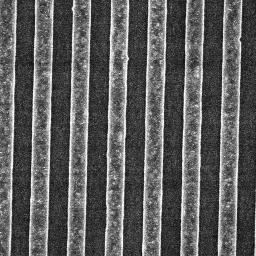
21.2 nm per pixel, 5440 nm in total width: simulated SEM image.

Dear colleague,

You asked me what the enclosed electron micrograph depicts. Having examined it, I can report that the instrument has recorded parallel lines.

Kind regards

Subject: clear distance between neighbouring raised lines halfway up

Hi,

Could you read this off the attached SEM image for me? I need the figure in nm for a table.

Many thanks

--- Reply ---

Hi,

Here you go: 438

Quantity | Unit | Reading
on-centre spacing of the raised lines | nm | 801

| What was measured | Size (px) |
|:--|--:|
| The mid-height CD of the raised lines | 16.7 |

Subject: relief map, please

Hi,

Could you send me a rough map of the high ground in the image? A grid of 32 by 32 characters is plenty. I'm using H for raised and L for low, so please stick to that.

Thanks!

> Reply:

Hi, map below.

HHLLHHHLLHHLLLHHLLLHHLLHHLLLHHLL
HHLLHHHLLHHLLLHHLLLHHLLHHLLLHHLL
HHLLHHHLLHHLLLHHLLLHHLLHHLLLHHLL
HHLLHHLLLHHLLLHHLLLHHLLHHLLLHHLL
HHLLHHLLLHHLLLHHLLLHHLLHHLLLHHLL
HHLLHHLLLHHLLLHHLLLHHLLHHLLLHHLL
HHLLHHHLLHHLLLHHLLLHHLLHHLLLHHLL
HHLLHHLLLHHLLLHHLLLHHLLHHLLLHHLL
HHLLHHLLLHHLLLHHLLHHHLLHHLLLHHLL
HHLLHHLLLHHLLLHHLLHHHLLHHLLLHHLL
HHLLHHLLLHHLLLHHLLHHHLLHHLLLHHLL
HHLLHHLLLHHLLLHHLLHHLLLHHLLLHHLL
HHLLHHLLLHHLLLHHLLHHLLLHHLLLHHLL
HHLLHHLLLHHLLLHHLLHHLLLHHLLLHHLL
HHLLHHLLLHHLLLHHLLHHLLLHHLLLHHLL
HHLLHHLLLHHLLLHHLLHHLLLHHLLLHHLL
HHLLHHLLLHHLLLHHLLHHLLLHHLLLHHLL
HHLLHHLLLHHLLHHHLLHHLLLHHLLLHHLL
HHLLHHLLLHHLLHHHLLHHLLLHHLLLHHLL
HHLLHHLLLHHLLHHHLLHHLLLHHLLLHHLL
HHLLHHLLLHHLLLHHLLHHLLLHHLLLHHLL
HLLLHHLLLHHLLLHLLLHHLLLHHLLLHHLL
HLLLHHLLLHHLLHHLLLHHLLLHHLLHHHLL
HLLLHHLLLHHLLHHLLLHHLLLHHLLLHHLL
HLLLHHLLLHHLLHHLLLHHLLLHHLLLHHLL
HLLLHHLLLHHLLHHLLLHHLLLHHLLLHLLL
HLLLHHLLLHHLLLHLLLHHLLLHHLLHHHLL
HLLLHHLLLHHLLHHLLLHHLLLHHLLHHHLL
HLLLHHLLLHHLLHHLLLHHLLLHHLLHHHLL
HLLLHHLLLHHLLHHLLLHHLLLHHLLHHLLL
HLLLHHLLLHLLLHHLLLHHLLLHHLLHHLLL
HLLLHHLLHHLLLHHLLLHHLLLHHLLHHLLL